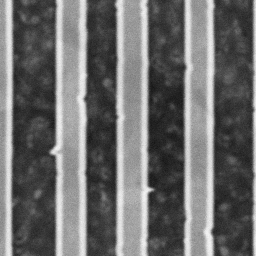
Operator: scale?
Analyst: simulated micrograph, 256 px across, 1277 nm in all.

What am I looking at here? one or a few lines or trenches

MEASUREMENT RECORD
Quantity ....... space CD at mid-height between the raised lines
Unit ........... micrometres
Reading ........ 0.215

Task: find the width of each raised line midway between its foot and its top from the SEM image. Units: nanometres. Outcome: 118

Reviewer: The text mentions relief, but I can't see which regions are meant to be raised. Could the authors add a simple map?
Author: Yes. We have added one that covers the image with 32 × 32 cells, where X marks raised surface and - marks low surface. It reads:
X------XXX-----XXX-----XXX------
X------XXX-----XXX-----XXX------
X------XXX-----XXX------XX------
X------XXX-----XXX------XX------
X------XXX-----XXX------XX------
X------XXX-----XXX------XX------
X------XXX-----XXX------XX------
X------XXX-----XXX------XX------
X------XXX-----XXX------XX------
X------XXX-----XXX-----XXX------
X------XXX-----XXX-----XXX------
X------XXX-----XXX-----XXX------
X------XXX-----XXX-----XXX------
X------XXX-----XXX-----XXX------
X------XXX-----XXX-----XXX------
X------XXX-----XXX-----XXX------
X------XXX-----XXX-----XXX------
X------XXX-----XXX-----XXX------
X------XXX-----XXX-----XXX------
X------XXX-----XXX-----XXX------
X------XXX-----XXX-----XXX------
X------XXX-----XXX-----XXX------
X------XXX-----XXX-----XXX------
X------XXX-----XXX-----XXX------
X------XXX-----XXX-----XXX------
X------XXX-----XXX-----XXX------
X------XXX-----XXX-----XXX------
X------XXX-----XXX------XX------
X------XXX-----XXX-----XXX------
X------XXX-----XXX-----XXX------
X------XXX-----XXX-----XXX------
X------XXX-----XXX-----XXX------